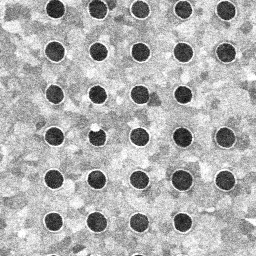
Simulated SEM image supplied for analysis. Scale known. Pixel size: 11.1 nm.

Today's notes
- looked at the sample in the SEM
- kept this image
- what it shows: a regular array of holes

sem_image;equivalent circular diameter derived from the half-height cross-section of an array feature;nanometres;219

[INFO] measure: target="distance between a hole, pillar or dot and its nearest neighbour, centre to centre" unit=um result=0.468